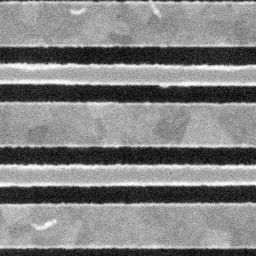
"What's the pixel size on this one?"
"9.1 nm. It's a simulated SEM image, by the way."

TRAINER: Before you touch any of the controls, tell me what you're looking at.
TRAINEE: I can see lines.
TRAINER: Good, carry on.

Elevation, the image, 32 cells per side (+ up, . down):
++++++++++++++++++++++++++++++++
++++++++++++++++++++++++++++++++
++++++++++++++++++++++++++++++++
++++++++++++++++++++++++++++++++
++++++++++++++++++++++++++++++++
++++++++++++++++++++++++++++++++
................................
................................
++++++++++++++++++++++++++.+++++
++++++++++++++++++++++++++++++++
............+.+++++++++.++++++++
................................
................................
++++++++++++++++++++++++++++++++
++++++++++++++++++++++++++++++++
++++++++++++++++++++++++++++++++
++++++++++++++++++++++++++++++++
++++++++++++++++++++++++++++++++
................................
................................
................................
++++++++++++++++++++++++++++++++
++++++++++++++++++++++++++++++++
................................
................................
.....+++++++.+.+.+++++++++++++++
++++++++++++++++++++++++++++++++
++++++++++++++++++++++++++++++++
++++++++++++++++++++++++++++++++
++++++++++++++++++++++++++++++++
++++++++++++++++++++++++++++++++
................................